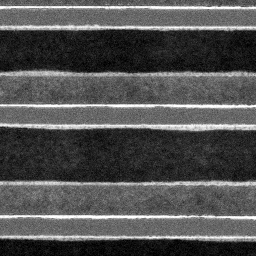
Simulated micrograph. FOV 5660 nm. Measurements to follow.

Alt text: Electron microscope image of lines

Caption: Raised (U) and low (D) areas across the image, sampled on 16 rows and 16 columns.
UUUUUUUUUUUUUUUU
UUUUUUUUUUUUUUUU
DDDDDDDDDDDDDDDD
DDDDDDDDDDDDDDDD
DDDDDDDDDDDDDDDD
UUUUUUUUUUUUUUUU
UUUUUUUUUUUUUUUU
UUUUUUUUUUUUUUUU
DDDDDDDDDDDDDDDD
DDDDDDDDDDDDDDDD
DDDDDDDDDDDDDDDD
UDUDDDDDDDDDDDDD
UUUUUUUUUUUUUUUU
UUUUUUUUUUUUUUUU
UUUUUUUUUUUUUUUU
DDDDDDDDDDDDDDDD